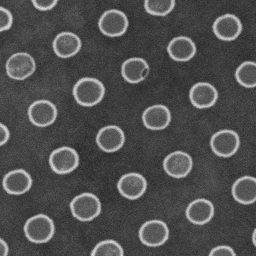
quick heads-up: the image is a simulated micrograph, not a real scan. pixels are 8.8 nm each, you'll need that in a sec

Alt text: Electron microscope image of a regular array of raised bodies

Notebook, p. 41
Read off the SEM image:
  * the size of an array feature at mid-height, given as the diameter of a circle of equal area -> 228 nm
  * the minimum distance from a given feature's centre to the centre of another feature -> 448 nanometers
